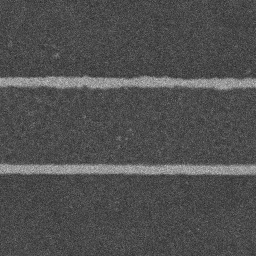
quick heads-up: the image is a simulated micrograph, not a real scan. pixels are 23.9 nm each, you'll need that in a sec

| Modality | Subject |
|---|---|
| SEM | one or a few lines or trenches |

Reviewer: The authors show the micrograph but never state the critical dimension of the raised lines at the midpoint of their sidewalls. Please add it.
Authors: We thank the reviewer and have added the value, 2090 nm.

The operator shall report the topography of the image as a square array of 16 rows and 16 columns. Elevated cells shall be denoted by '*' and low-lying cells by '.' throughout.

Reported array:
................
................
................
................
................
****************
****************
****************
****************
****************
****************
................
................
................
................
................